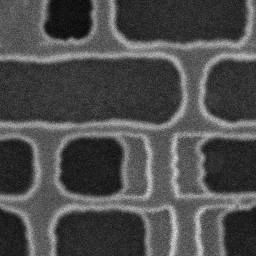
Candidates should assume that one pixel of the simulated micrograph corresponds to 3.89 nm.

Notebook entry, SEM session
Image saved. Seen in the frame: one or a few lines or trenches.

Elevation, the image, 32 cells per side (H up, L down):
HHHHHHLLLLLLHHLLLLLLLLLLLLLLLLLH
HHHHHHLLLLLLHHLLLLLLLLLLLLLLLLLH
HHHHHHLLLLLLHHLLLLLLLLLLLLLLLLLH
HHHHHLLLLLLHHHLLLLLLLLLLLLLLLLLH
HHHHHHLLLLLHHHHLLLLLLLLLLLLLLLLH
HHHHHHHHHHHHHHHHHHHHHHLLHHHHHHHH
HHHHHHHHHHHHHHHHHHHHHHHHHHHHHHHH
LLLLHHHLLLLLLLLLLLLLLHHHHHHLLLLL
LLLLLLLLLLLLLLLLLLLLLLHHHHLLLLLL
LLLLLLLLLLLLLLLLLLLLLLLHHHLLLLLL
LLLLLLLLLLLLLLLLLLLLLLLHHLLLLLLL
LLLLLLLLLLLLLLLLLLLLLLLHHHLLLLLL
LLLLLLLLLLLLLLLLLLLLLLLHHLLLLLLL
LLLLLLLLLLLLLLLLLLLLLLLHHLLLLLLL
LLLLLLLLLLLLLLLLLLLLLLHHHHLLLLLL
HHLHHHLLHLLHHHHHHHLLLHHHHHHHHHHH
HHHHHHHHHHHHHHHHHHHHHHHHHHHHHHHH
LLLHHHHHHLLLLLLHHHHHHHHHHHLLLLLL
LLLLHHHHLLLLLLLLHHHHHHHHHLLLLLLL
LLLLHHHHLLLLLLLLHHHHHHHHHLLLLLLL
LLLLHHHLLLLLLLLHHHHHHHHHHLLLLLLL
LLLLHHHHLLLLLLLHHHHHHHHHHLLLLLLL
LLLLHHHLLLLLLLLHHHHHHHHHHLLLLLLL
LLLLHHHHLLLLLLLHHHHHHHHHHHLLLLLL
HLLHHHHHHHHLLLHHHHHHHHHHHHHHHHHH
HHHHHHHHHHHHHHHHHHHHHHHHHHHHHHHH
LLHHHHHHLLLLLLLLLHHHHHHHHHHHHLLL
LLLHHHHLLLLLLLLLLLHHHHHHHHHHLLLL
LLLHHHHLLLLLLLLLLLHHHHHHHHHHLLLL
LLLHHHHLLLLLLLLLLLHHHHHHHHHHLLLL
LLLLHHHLLLLLLLLLLLHHHHHHHHHHLLLL
LLLLHHHLLLLLLLLLLLHHHHHHHHHHLLLL